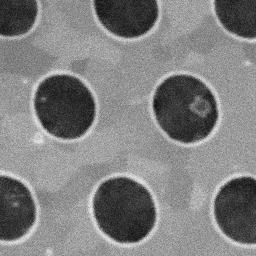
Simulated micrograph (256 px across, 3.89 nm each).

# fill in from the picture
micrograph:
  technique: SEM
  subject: holes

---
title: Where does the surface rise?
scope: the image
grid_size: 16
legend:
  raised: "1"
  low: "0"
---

0011110000111000
0011110000111100
1111111111111111
1111111111111111
1111111111111111
1100001111000111
1100001110000011
1100001111000011
1110011111000111
1111111111111111
1111111111111111
0011110001111100
0011110000111000
0011110000111000
0011110000111100
1111111111111111